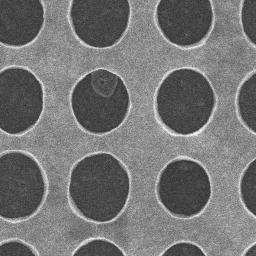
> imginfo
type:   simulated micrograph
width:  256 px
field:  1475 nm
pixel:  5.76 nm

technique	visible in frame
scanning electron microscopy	holes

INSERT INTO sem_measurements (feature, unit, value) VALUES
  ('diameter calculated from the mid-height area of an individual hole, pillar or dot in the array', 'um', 0.352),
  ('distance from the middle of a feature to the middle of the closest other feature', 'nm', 489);